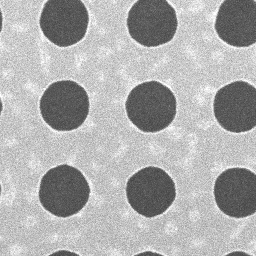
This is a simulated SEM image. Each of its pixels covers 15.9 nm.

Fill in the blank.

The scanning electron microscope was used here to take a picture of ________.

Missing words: holes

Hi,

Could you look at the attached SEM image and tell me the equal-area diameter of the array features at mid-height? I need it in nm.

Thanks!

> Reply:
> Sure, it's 818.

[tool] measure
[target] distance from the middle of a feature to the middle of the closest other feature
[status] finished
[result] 85.3 pixels